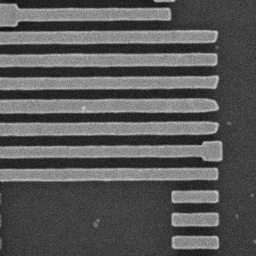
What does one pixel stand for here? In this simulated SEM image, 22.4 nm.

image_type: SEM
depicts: wiring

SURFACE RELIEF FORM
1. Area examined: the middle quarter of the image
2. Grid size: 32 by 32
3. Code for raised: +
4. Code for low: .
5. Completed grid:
++++++++++++....................
................................
................................
.......+++++..++++++++++++++++++
++++++++++++++++++++++++++++++++
++++++++++++++++++++++++++++++++
................................
................................
................................
++++++++++++++++++++++++++++++++
++++++++++++++++++++++++++++++++
++++++++++++++++++++++++++++++++
................................
................................
................................
++++++++++++++++++++++++++++++++
++++++++++++++++++++++++++++++++
++++++++++++++++++++++++++++++.+
................................
................................
................................
++++++++++++++++++++++++++++++++
++++++++++++++++++++++++++++++++
................................
................................
................................
++++++++++++++++++++++++++++++++
++++++++++++++++++++++++++++++++
++++++++++++++++++++++++++++++++
................................
................................
................................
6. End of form